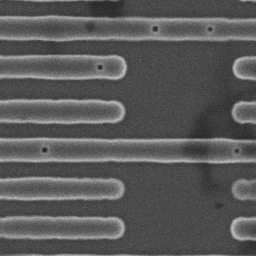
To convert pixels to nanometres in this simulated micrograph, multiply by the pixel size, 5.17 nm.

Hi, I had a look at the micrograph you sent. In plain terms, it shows wiring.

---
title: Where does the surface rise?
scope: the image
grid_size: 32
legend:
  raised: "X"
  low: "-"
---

--------------------------------
--------------------------------
XXXXXXXXXXXXXXXXXXXXXXXXXXXXX--X
XXXXXXXXXXXXXXXXXXX-XXXXXXXXXXXX
XXXXXXXXXXXXXXXXXXXXXXXXXXXXXXXX
--------------------------------
--------------------------------
XXXXXXXXXXXXXXX---------------XX
XXXXXXXXXXXXXXXX-------------XXX
XXXXXXXXXXXXXXX---------------XX
--------------------------------
--------------------------------
--------------------------------
XXXXXXXXXXXXXXX--------------XXX
XXXXXXXXXXXXXXX--------------XXX
--------------------------------
--------------------------------
XXXXXXXXXXXXX-------XXXXXXXXX---
XXXXXXXXXXXXXXXXXXXXXXXXXXXXXXXX
XXXXXXXXXXXXXXXXXXXXXXXXXXXXXXXX
--------------------------------
--------------------------------
XXXXXXXXXXXXXXX-----------------
XXXXXXXXXXXXXXX--------------XXX
XXXXXXXXXXXXXXX---------------XX
--------------------------------
--------------------------------
XXXXXXXXXXXXXXX--------------XXX
XXXXXXXXXXXXXXX--------------XXX
XXXXXXXXXXXXXXX--------------XXX
--------------------------------
--------------------------------